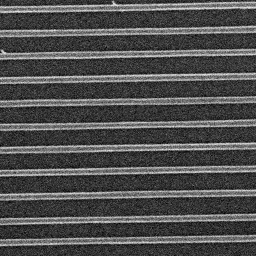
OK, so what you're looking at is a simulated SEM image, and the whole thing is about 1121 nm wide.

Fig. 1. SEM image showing parallel lines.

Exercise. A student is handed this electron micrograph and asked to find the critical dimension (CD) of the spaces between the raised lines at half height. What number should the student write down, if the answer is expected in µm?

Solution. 0.0783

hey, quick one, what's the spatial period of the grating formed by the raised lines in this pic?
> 102 nanometres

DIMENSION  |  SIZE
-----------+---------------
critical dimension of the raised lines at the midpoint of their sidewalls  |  0.0224 micrometres